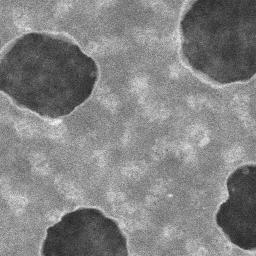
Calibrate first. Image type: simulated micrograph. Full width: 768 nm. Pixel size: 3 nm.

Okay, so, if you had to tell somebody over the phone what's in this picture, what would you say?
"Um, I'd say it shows holes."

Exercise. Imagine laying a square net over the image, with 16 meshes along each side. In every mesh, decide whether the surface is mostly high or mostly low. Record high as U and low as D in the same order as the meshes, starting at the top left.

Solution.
UUUUUUUUUUUUDDDD
UUUUUUUUUUUDDDDD
UDDDUUUUUUUDDDDD
DDDDDUUUUUUDDDDD
DDDDDDUUUUUUDDDD
DDDDDDUUUUUUUUUU
UDDDDUUUUUUUUUUU
UUUUUUUUUUUUUUUU
UUUUUUUUUUUUUUUU
UUUUUUUUUUUUUUUU
UUUUUUUUUUUUUUUD
UUUUUUUUUUUUUUDD
UUUUUUUUUUUUUUDD
UUUUDDDUUUUUUUDD
UUUDDDDDUUUUUUDD
UUUDDDDDUUUUUUUD